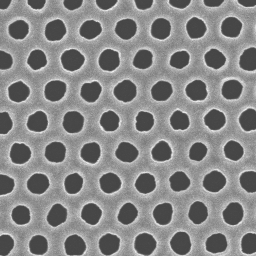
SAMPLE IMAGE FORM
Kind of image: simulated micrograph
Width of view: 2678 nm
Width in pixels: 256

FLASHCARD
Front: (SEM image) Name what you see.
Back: a regular array of holes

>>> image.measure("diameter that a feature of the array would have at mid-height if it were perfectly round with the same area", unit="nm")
213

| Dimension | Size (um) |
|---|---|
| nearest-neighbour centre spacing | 0.364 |